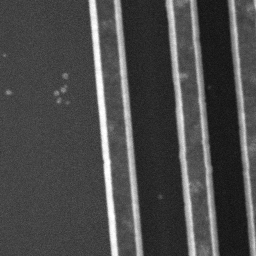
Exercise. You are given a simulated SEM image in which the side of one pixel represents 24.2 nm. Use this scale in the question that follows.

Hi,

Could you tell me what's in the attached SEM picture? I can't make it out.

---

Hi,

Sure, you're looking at one or a few lines or trenches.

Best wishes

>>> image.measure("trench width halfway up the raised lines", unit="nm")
1090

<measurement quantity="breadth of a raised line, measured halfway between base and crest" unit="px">24.8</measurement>